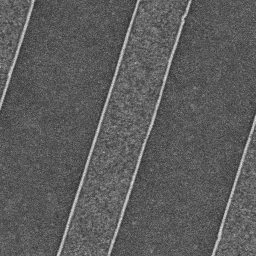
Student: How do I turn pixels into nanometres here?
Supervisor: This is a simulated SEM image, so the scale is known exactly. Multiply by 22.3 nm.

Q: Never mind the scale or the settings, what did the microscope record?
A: one or a few lines or trenches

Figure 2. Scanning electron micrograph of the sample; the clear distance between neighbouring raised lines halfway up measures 2220 nm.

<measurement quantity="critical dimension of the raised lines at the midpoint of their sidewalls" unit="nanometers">1090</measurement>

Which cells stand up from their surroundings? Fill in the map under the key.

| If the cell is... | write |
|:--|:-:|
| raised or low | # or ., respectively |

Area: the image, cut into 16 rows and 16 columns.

##.......###....
##......###.....
#.......###.....
#.......###.....
#......###......
.......###......
.......###......
......####......
......###.......
......###......#
.....####......#
.....###.......#
.....###......##
....####......##
....###.......##
....###......###